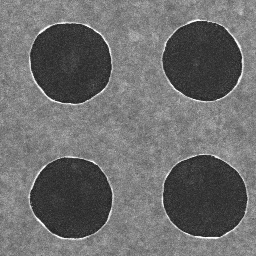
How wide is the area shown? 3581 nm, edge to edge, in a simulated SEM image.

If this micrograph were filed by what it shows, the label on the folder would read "holes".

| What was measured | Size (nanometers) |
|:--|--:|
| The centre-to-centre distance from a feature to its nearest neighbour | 1860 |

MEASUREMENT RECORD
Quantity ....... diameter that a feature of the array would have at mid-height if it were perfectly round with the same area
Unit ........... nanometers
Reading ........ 1150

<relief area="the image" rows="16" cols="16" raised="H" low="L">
HHHHHHHHHHHHHHHH
HHHHLHHHHHHHLLHH
HHLLLLLHHHHLLLLH
HHLLLLLHHHLLLLLH
HHLLLLLHHHLLLLLH
HHHLLLLHHHHLLLLH
HHHHHHHHHHHHHHHH
HHHHHHHHHHHHHHHH
HHHHHHHHHHHHHHHH
HHHHHHHHHHHHHHHH
HHHLLLHHHHHLLLLH
HHLLLLLHHHLLLLLH
HHLLLLLHHHLLLLLH
HHLLLLLHHHHLLLLH
HHHLLLHHHHHHLLHH
HHHHHHHHHHHHHHHH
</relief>